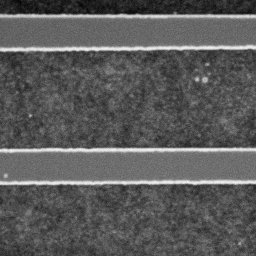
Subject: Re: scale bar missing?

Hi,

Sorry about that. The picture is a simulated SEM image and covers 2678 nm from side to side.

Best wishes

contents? lines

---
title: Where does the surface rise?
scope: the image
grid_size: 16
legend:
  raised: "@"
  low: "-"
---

----------------
@@@@@@@@@@@@@@@@
@@@@@@@@@@@@@@@@
----------------
----------------
----------------
----------------
----------------
----------------
@@@@@@@@@@@@@@@@
@@@@@@@@@@@@@@@@
@@@@------------
----------------
----------------
----------------
----------------